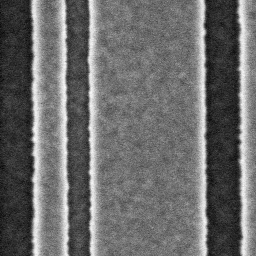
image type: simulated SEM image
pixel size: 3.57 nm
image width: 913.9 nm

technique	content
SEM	lines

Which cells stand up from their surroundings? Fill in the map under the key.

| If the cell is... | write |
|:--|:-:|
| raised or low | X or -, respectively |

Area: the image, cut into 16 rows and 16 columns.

--XXXXXXXXXXX--X
--XXXXXXXXXXX--X
--XXXXXXXXXXX--X
--XXXXXXXXXXX--X
--XXXXXXXXXXX--X
--XXXXXXXXXXX--X
--XXXXXXXXXXX--X
--XXXXXXXXXXX--X
--XXXXXXXXXXX--X
--XXXXXXXXXXX--X
--XXXXXXXXXXX--X
--XXXXXXXXXXX--X
--XXXXXXXXXXX--X
--XXXXXXXXXXX--X
--XXXXXXXXXXX--X
--XXXXXXXXXXX--X